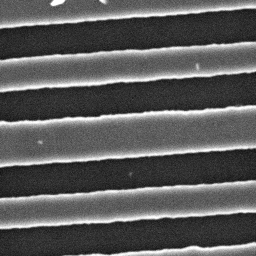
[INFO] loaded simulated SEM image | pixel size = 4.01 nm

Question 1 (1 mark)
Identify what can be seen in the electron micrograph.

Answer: lines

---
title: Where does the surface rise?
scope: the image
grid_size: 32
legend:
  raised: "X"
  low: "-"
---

XXXXXXXXXXXXXXXXXXXXXXXXXXXXXXXX
XXXXXXXXXXXXXXXXXXXXXXXXX-------
XXXXXXXXXXXX--------------------
X-------------------------------
--------------------------------
-----------------------------XXX
--------------XXXXXXXXXXXXXXXXXX
XXXXXXXXXXXXXXXXXXXXXXXXXXXXXXXX
XXXXXXXXXXXXXXXXXXXXXXXXXXXXXXXX
XXXXXXXXXXXXXXXXXXXXXXXXXXX-----
XXXXXXXXXXXX--------------------
--------------------------------
--------------------------------
----------------------------XXXX
-------------XXXXXXXXXXXXXXXXXXX
XXXXXXXXXXXXXXXXXXXXXXXXXXXXXXXX
XXXXXXXXXXXXXXXXXXXXXXXXXXXXXXXX
XXXXXXXXXXXXXXXXXXXXXXXXXXXXXXXX
XXXXXXXXXXXXXXXXXXXXXXXXXXXXXXX-
XXXXXXXXXXXXXXXXXXX-------------
XXXX----------------------------
--------------------------------
--------------------------------
------------------XXXXXXXXXXXXXX
-----XXXXXXXXXXXXXXXXXXXXXXXXXXX
XXXXXXXXXXXXXXXXXXXXXXXXXXXXXXXX
XXXXXXXXXXXXXXXXXXXXXXXXXXXXXX--
XXXXXXXXXXXXXXXX----------------
XX------------------------------
--------------------------------
-------------------------------X
------------------XXXXXXXXXXXXXX